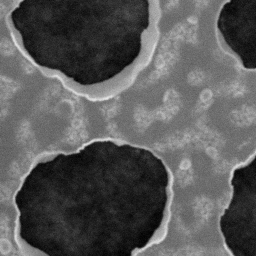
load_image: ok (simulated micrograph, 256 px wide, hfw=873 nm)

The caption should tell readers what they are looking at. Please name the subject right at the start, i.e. holes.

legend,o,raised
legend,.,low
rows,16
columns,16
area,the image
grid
o........ooooo..
o.........oooo..
o........ooooo..
oo.......oooooo.
oooo....oooooooo
ooooo..ooooooooo
oooooooooooooooo
oooooooooooooooo
oooooooooooooooo
ooooo....ooooooo
oo........ooooo.
o..........oooo.
o.........oooo..
o.........oooo..
o.........oooo..
oo.......ooooo..